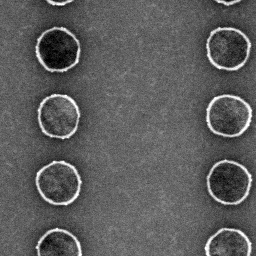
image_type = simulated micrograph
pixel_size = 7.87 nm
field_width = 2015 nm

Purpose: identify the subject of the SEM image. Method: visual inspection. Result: raised bodies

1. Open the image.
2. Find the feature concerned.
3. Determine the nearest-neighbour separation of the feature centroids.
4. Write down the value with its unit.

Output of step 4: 525 nm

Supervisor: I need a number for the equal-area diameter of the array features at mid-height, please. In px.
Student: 41.8